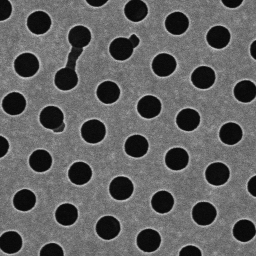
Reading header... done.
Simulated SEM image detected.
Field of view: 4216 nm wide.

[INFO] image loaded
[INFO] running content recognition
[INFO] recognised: a regular array of holes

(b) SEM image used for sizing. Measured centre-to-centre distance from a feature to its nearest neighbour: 0.686 microns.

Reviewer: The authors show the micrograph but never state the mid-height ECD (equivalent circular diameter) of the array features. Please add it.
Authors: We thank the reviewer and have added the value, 392 nm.